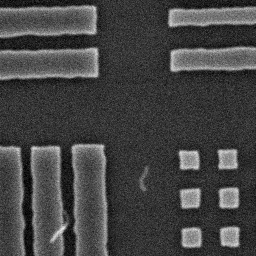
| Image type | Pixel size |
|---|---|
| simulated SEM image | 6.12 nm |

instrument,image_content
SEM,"groups of lines, slits or small figures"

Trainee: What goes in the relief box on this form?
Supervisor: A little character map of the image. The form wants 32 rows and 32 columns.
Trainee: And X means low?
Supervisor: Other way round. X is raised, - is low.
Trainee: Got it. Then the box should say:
--------------------------------
XXXXXXXXXXXX---------XXXXXXXXXXX
XXXXXXXXXXXX---------XXXXXXXXXXX
XXXXXXXXXXXX--------------------
XX------------------------------
--------------------------------
XXXXXXXXXXXX----------XXXXXXXXXX
XXXXXXXXXXXX---------XXXXXXXXXXX
XXXXXXXXXXXX---------XXXXXXXXXXX
XXXXXX--XX----------------------
--------------------------------
--------------------------------
--------------------------------
--------------------------------
--------------------------------
--------------------------------
--------------------------------
--------------------------------
XX--XXX--XXXX-------------------
XX--XXX--XXXX----------XX--XXX--
XXX-XXX--XXXX----------XX--XXX--
XXX-XXX--XXXX-------------------
XXX-XXX--XXXX-------------------
XXX-XXXX-XXXX-------------------
XXX-XXXX-XXXX----------XX---XX--
XXX-XXXX-XXXX----------XX---XX--
XXX-XXXX-XXXX-------------------
XXX-XXXX-XXXX-------------------
XXX-XXXX-XXXX---------------X---
XXX-XXXX--XXX----------XX---XX--
XXX-XXXX--XXX----------XX---XX--
XXX-XXXX--XXX-------------------